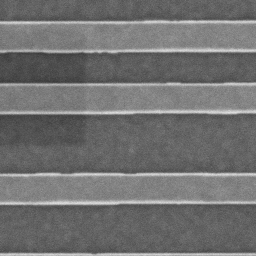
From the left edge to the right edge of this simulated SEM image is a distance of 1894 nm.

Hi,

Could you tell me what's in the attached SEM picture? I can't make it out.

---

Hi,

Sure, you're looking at lines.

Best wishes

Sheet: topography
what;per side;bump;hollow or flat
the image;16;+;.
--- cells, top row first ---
................
++++++++++++++++
++++++++++++++++
................
................
++++++++++++++++
++++++++++++++++
................
................
................
................
++++++++++++++++
++++++++++++++++
................
................
................